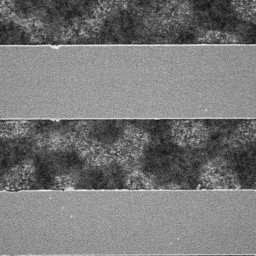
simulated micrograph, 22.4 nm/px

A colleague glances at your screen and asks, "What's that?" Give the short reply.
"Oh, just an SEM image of one or a few lines or trenches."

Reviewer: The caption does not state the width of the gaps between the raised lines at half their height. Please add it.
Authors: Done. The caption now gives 1590 nanometers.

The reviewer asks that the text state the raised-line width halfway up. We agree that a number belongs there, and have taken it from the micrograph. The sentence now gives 1.63 micrometres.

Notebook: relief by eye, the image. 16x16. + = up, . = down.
................
................
................
++++++++++++++++
++++++++++++++++
++++++++++++++++
++++++++++++++++
................
................
................
................
................
++++++++++++++++
++++++++++++++++
++++++++++++++++
++++++++++++++++